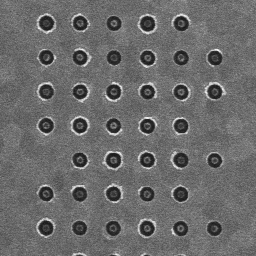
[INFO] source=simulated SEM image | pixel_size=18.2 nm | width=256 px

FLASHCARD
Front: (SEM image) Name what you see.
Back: a regular array of ring-shaped grooves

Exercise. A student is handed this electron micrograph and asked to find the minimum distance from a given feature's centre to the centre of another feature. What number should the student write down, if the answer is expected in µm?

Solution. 0.612